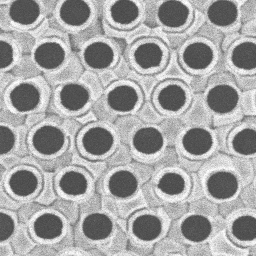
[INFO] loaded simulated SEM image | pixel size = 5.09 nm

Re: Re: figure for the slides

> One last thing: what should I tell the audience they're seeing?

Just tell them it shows a regular array of holes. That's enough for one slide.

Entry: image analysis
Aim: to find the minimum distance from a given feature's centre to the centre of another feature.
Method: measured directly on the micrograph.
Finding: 249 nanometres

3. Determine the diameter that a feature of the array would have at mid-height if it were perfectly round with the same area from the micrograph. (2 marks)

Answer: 28.7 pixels